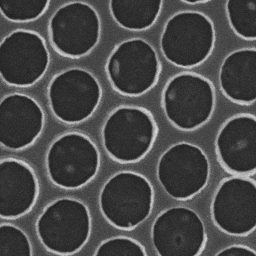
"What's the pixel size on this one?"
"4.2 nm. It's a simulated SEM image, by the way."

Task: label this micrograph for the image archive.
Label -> a regular array of holes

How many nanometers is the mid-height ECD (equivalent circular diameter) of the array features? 216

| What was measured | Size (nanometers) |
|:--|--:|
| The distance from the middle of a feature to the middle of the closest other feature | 265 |